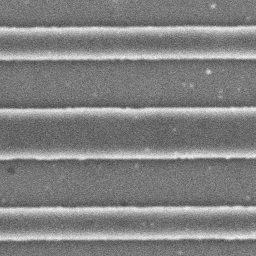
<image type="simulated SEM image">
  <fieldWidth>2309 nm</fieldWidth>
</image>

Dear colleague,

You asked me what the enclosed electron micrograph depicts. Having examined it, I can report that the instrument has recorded lines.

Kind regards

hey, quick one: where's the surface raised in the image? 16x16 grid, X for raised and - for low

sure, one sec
----------------
----------------
XXXXXXXXXXXXXXXX
XXXXXXXXXXXXXXXX
----------------
----------------
----------------
XXXXXXXXXXXXXXXX
XXXXXXXXXXXXXXXX
XXXXXXXXXXXXXXXX
----------------
----------------
----------------
XXXXXXXXXXXXXXXX
XXXXXXXXXXXXXXXX
----------------